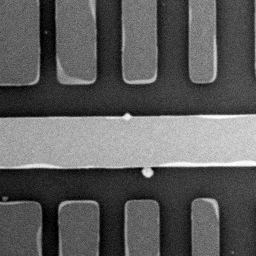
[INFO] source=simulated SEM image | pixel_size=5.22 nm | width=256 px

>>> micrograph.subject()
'groups of lines, slits or small figures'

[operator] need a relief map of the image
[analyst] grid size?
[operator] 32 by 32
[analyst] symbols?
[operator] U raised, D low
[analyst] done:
UUUUUDDUUUUUDDDUUUUDDDDDUUUDDDDD
UUUUUDDUUUUUDDDUUUUDDDDDUUUDDDDD
UUUUUDDUUUUUDDDUUUUDDDDDUUUDDDDD
UUUUUDDUUUUUDDDUUUUUDDDDUUUDDDDD
UUUUUDDUUUUUDDDUUUUUDDDDUUUDDDDD
UUUUUDDUUUUUDDDUUUUUDDDDUUUDDDDD
UUUUUDDUUUUUDDDUUUUUDDDDUUUDDDDD
UUUUUDDUUUUUDDDUUUUUDDDDUUUDDDDD
UUUUUDDUUUUUDDDUUUUUDDDDUUUDDDDD
UUUUUDDDUUUUDDDUUUUDDDDDUUUDDDDD
UUUUDDDDDDDDDDDDDDDDDDDDDDDDDDDD
DDDDDDDDDDDDDDDDDDDDDDDDDDDDDDDD
DDDDDDDDDDDDDDDDDDDDDDDDDDDDDDDD
DDDDDDDDDDDDDDDDDDDDDDDDDDDDDDDD
DDDDDDDDDDDDDDDUUDDDDDDUUDDDDUUU
UUUUUUUUUUUUUUUUUUUUUUUUUUUUUUUU
UUUUUUUUUUUUUUUUUUUUUUUUUUUUUUUU
UUUUUUUUUUUUUUUUUUUUUUUUUUUUUUUU
UUUUUUUUUUUUUUUUUUUUUUUUUUUUUUUU
UUUUUUUUUUUUUUUUUUUUUUUUUUUUUUUU
UUUUUUUUUUUUUUUUUUUUUUUUUUUUUDDD
DDDDDDDDDDDDDDDDDDUDDDDDDDDDDDDD
DDDDDDDDDDDDDDDDDDDDDDDDDDDDDDDD
DDDDDDDDDDDDDDDDDDDDDDDDDDDDDDDD
DDDDDDDDDDDDDDDDDDDDDDDDDDDDDDDD
UUUUUDDDUUUUDDDDUUUUDDDDUUUDDDDD
UUUUUDDUUUUUDDDDUUUUDDDDUUUDDDDD
UUUUUDDUUUUUDDDDUUUUDDDDUUUDDDDD
UUUUUDDUUUUUDDDDUUUUDDDDUUUDDDDD
UUUUUDDUUUUUDDDDUUUUDDDDUUUDDDDD
UUUUUDDUUUUUDDDDUUUUDDDDUUUDDDDD
UUUUUDDDUUUUDDDDUUUUDDDDUUUDDDDD